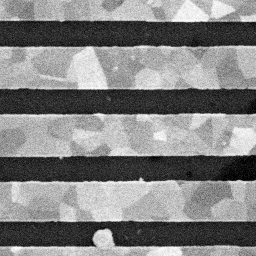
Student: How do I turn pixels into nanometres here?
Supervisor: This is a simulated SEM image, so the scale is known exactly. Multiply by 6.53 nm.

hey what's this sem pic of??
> lines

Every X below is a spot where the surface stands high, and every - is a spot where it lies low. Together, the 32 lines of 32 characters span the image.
XXXXXXXXXXXXXXXXXXXXXXXXXXXXXXXX
XXXXXXXXXXXXXXXXXXXXXXXXXXXXXXXX
-------X---X------XXXXXXXXXXXXXX
--------------------------------
--------------------------------
--------------------------------
XXXXXXXXXXXXXXXXXXXXXXXXXXXXXXXX
XXXXXXXXXXXXXXXXXXXXXXXXXXXXXXXX
XXXXXXXXXXXXXXXXXXXXXXXXXXXXXXXX
XXXXXXXXXXXXXXXXXXXXXXXXXXXXXXXX
XXXXXXXXXXXXXXXXXXXXXXXXXXXXXXXX
--------------------------------
--------------------------------
--------------------------------
XXXXXXXXXXXXXXXXXXXXXXXXXXXXXXXX
XXXXXXXXXXXXXXXXXXXXXXXXXXXXXXXX
XXXXXXXXXXXXXXXXXXXXXXXXXXXXXXXX
XXXXXXXXXXXXXXXXXXXXXXXXXXXXXXXX
XXXXXXXXXXXXXXXXXXXXXXXXXXXXXXXX
XXXXXXXXX-XXX-------------------
--------------------------------
--------------------------------
--------------------------------
XXXXXXXXXXXXXXXXXXXXXXXXXXXXXXXX
XXXXXXXXXXXXXXXXXXXXXXXXXXXXXXXX
XXXXXXXXXXXXXXXXXXXXXXXXXXXXXXXX
XXXXXXXXXXXXXXXXXXXXXXXXXXXXXXXX
XXXXXXXXXXXXXXXXXXXXXXXXXXXXXXXX
--------------------------------
------------XX------------------
------------XX------------------
XXXXXXXXXXXXXXXXXXXXXXXXXXXXXXXX